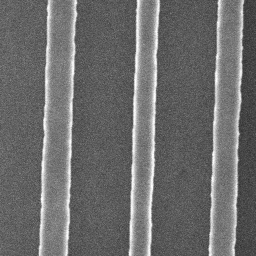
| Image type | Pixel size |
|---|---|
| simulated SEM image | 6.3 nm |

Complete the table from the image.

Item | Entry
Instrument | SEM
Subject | lines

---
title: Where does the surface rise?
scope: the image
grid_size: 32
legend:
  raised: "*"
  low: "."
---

......****.......***.......***..
......****.......***.......***..
......***........***.......***..
......***........***.......***..
......***........***.......***..
......***........***.......***..
......***........***.......***..
......***........***.......***..
......***........***.......***..
......***........***.......***..
......***........***.......***..
......***........**........***..
......***........**........***..
......***........**........***..
......***........**........***..
......***........**........***..
......***........**........***..
......***........**........***..
.....****........**........***..
.....****........**........***..
.....****........**........***..
.....****........**........***..
.....****........**........***..
.....****........**........***..
.....****.......***.......****..
.....****.......***........**...
.....****.......***.......***...
.....****.......***.......***...
.....***........***.......***...
.....***........***.......***...
.....***........***.......***...
.....***........***.......***...